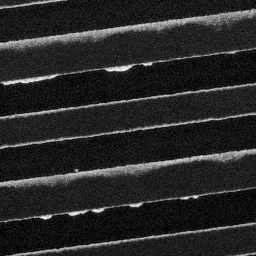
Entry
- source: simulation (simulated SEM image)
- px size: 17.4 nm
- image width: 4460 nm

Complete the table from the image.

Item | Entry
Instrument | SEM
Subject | lines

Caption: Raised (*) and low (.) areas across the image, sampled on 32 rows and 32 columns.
*****...........................
...............................*
.......................*********
...............*****************
.........***********************
.*******************************
*****************************...
*********************...........
**************..................
******..........................
...............................*
.......................*********
................****************
........************************
.*****************************..
***********************.........
****************................
********........................
*...............................
..........................******
...................*************
............********************
.....***************************
********************************
*************************.......
*****************...............
**********......................
**..............................
...........................*****
...................*************
............********************
....****************************